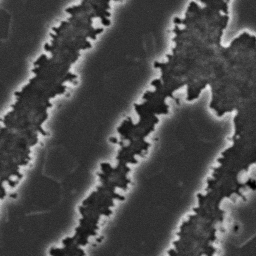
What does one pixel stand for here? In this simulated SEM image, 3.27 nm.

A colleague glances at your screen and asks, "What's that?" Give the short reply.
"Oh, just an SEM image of one or a few lines or trenches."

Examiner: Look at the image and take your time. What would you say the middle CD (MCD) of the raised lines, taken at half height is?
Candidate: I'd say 226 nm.